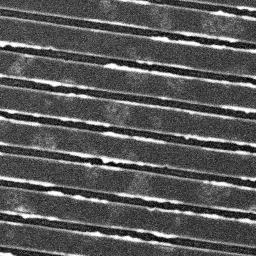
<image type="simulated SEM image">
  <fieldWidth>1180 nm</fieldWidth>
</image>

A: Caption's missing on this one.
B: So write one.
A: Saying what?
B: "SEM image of parallel lines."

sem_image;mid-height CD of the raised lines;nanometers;122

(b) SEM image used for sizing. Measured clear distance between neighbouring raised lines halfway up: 7.55 pixels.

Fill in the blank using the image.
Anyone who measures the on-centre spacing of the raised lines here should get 155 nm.